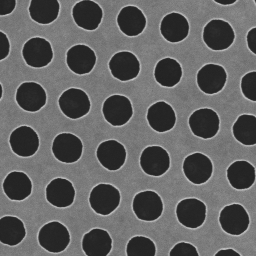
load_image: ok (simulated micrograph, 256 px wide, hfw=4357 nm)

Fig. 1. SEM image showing a regular array of holes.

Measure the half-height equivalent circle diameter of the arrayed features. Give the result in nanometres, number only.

508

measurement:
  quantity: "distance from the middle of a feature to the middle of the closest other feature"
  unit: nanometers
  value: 744